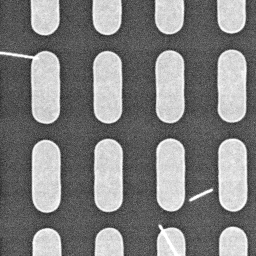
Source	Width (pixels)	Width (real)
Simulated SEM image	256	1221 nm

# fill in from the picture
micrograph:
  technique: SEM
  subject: groups of lines, slits or small figures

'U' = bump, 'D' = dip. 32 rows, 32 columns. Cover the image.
DDDDUUUDDDDDUUUDDDDDUUUDDDDUUUUD
DDDDUUUDDDDDUUUDDDDDUUUDDDDUUUUD
DDDDUUUDDDDDUUUDDDDDUUUDDDDUUUUD
DDDDUUUDDDDDUUUDDDDDUUDDDDDDUUDD
DDDDDDDDDDDDDDDDDDDDDDDDDDDDDDDD
DDDDDDDDDDDDDDDDDDDDDDDDDDDDDDDD
DDDDDUDDDDDDDUDDDDDDDUDDDDDDUUDD
DDDDUUUDDDDDUUUDDDDDUUUDDDDUUUUD
DDDDUUUDDDDDUUUDDDDDUUUDDDDUUUUD
DDDDUUUDDDDDUUUDDDDDUUUDDDDUUUUD
DDDDUUUDDDDDUUUDDDDDUUUDDDDUUUUD
DDDDUUUDDDDDUUUDDDDDUUUDDDDUUUUD
DDDDUUUDDDDDUUUDDDDDUUUDDDDUUUUD
DDDDUUUDDDDDUUUDDDDDUUUDDDDUUUUD
DDDDUUUDDDDDUUUDDDDDUUUDDDDDUUDD
DDDDDDDDDDDDDDDDDDDDDDDDDDDDDDDD
DDDDDDDDDDDDDDDDDDDDDDDDDDDDDDDD
DDDDDDDDDDDDDUDDDDDDDUDDDDDDUUDD
DDDDUUUDDDDDUUUDDDDDUUUDDDDUUUUD
DDDDUUUDDDDDUUUDDDDDUUUDDDDUUUUD
DDDDUUUDDDDDUUUDDDDDUUUDDDDUUUUD
DDDDUUUDDDDDUUUDDDDDUUUDDDDUUUUD
DDDDUUUDDDDDUUUDDDDDUUUDDDDUUUUD
DDDDUUUDDDDDUUUDDDDDUUUDDDDUUUUD
DDDDUUUDDDDDUUUDDDDDUUUDDDDUUUUD
DDDDUUUDDDDDUUUDDDDDUUUDDDDDUUUD
DDDDDDDDDDDDDDDDDDDDDDDDDDDDDDDD
DDDDDDDDDDDDDDDDDDDDDDDDDDDDDDDD
DDDDDDDDDDDDDDDDDDDDDDDDDDDDDUDD
DDDDUUUDDDDDUUUDDDDDUUUDDDDDUUUD
DDDDUUUDDDDDUUUDDDDDUUUDDDDDUUUD
DDDDUUUUDDDDUUUDDDDDUUUDDDDDUUUD